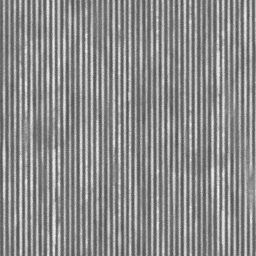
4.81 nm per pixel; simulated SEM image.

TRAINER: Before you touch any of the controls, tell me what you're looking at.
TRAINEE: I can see parallel lines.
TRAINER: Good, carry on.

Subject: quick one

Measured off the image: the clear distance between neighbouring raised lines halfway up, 0.0174 micrometres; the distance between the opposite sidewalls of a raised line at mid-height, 8.4 nanometres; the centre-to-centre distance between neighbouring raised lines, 5.49 pixels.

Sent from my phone